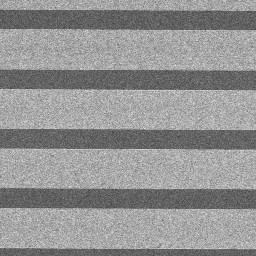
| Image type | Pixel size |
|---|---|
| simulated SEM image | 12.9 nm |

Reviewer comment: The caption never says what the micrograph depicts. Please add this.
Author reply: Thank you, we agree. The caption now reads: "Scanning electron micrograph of parallel lines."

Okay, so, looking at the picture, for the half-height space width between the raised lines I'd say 20.1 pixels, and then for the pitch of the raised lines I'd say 766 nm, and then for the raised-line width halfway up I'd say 0.506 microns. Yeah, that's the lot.